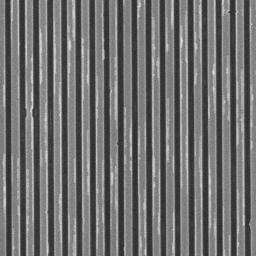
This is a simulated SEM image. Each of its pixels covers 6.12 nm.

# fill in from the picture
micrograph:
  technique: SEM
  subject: parallel lines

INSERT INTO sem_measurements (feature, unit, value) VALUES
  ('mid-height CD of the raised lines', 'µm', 0.0482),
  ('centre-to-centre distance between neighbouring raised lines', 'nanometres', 86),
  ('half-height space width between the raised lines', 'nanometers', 36.7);